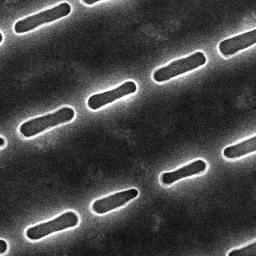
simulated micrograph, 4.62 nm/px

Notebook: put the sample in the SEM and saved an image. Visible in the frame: holes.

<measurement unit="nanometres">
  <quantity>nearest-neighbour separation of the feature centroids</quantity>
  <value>327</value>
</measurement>